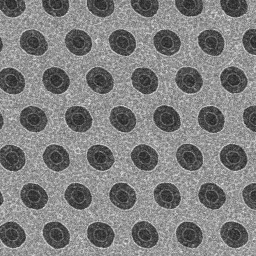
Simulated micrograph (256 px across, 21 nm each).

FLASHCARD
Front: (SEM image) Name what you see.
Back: a regular array of ring-shaped grooves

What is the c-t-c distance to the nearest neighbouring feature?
0.926 µm